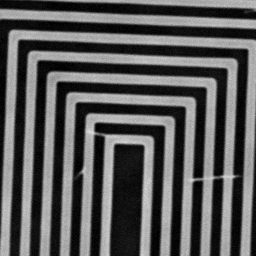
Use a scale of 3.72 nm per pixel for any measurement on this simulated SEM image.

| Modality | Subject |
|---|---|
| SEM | groups of lines, slits or small figures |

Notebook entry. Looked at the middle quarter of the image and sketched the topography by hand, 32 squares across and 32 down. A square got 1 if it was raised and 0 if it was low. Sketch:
00000000000000000000000000000000
00000000000000000000000000000000
11111111111100000000000000000000
11111111111111111111111111111111
00000001111111111111111111111111
00000000000000000000000000000000
00000000000000000000000000000000
01111111111100000000000000000000
01111111111111111111111111111111
01100000111111111111111111111111
01100000000000000000000000000111
01100000000000000000000000000001
01100000000000000000000000000001
11100011111111111111111111100001
11100011001111111111111111110001
11100111000000000000000001100011
11100111000000000000000000100011
11100111000000000000000001100011
11100110001111111111110001100011
11000110001111111111110001100011
11000110001100000000110001100011
11000110001100000000110001100011
11000110001100000000110001100011
11000110001100000000110001100011
11000110001100000000110001100011
11000110001100000000110001100011
11000110001100000000110001100011
11000110001100000000110001100011
11000110001100000000110001100011
11000110001100000000110001100011
11000110001100000000110001100011
11000110001100000000110001100011